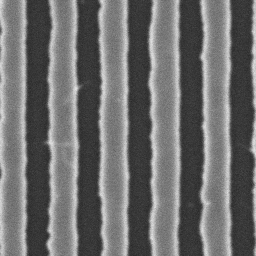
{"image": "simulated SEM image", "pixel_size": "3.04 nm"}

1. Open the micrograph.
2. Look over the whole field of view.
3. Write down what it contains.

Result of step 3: lines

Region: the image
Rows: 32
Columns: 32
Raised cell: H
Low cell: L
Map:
HHHLLLHHHHLLLHHHLLLHHHLLLHHHHLLL
HHHLLLHHHHLLHHHHLLLHHHLLLHHHHLLL
HHHLLLHHHHLLHHHHLLLHHHLLLHHHHLLL
HHHLLLLHHHLLLHHHLLLHHHLLLHHHHLLL
HHHLLLHHHHLLHHHHLLLHHHLLLLHHHLLL
HHHLLLHHHLLLLHHHLLLHHHLLLHHHHLLL
HHHLLLHHHHLLLHHHLLLHHHLLLHHHHLLL
HHHLLLHHHHLLLHHHLLLHHHLLLHHHHLLL
HHHLLLHHHLLLLHHHLLLHHHLLLHHHHLLL
HHHLLLHHHHLLLHHHLLLHHHLLLHHHHLLL
HHHLLLHHHHLLLHHHLLLHHHLLLHHHHLLL
HHHLLLHHHHLLLHHHLLLHHHLLLHHHHLLL
HHHLLLHHHHLLLHHHLLLHHHLLLHHHHLLL
HHHLLLHHHHLLLHHHLLLHHHLLLHHHHLLL
HHHLLLHHHHLLLHHHLLLHHHLLLHHHHLLL
HHHLLLHHHHLLHHHHLLLHHHLLLHHHHLLL
HHHLLLHHHHLLLHHHLLLHHHLLLLHHHLLL
HHHLLLHHHHLLLHHHLLLHHHLLLLHHHLLL
HHHLLLHHHHLLLHHHLLLHHHLLLLHHHLLL
HHHLLLHHHHLLLHHHLLLHHHLLLLHHHLLL
HHHLLLHHHHLLLHHHLLLHHHLLLLHHHLLL
HHHLLLHHHHLLLHHHLLLHHHLLLHHHHLLL
HHHLLLHHHHLLHHHHLLLHHHLLLHHHHLLL
HHHLLLHHHHLLHHHHLLLHHHLLLHHHHLLL
HHHLLLHHHHLLLHHHLLLHHHLLLHHHHLLL
HHHLLLHHHHLLLHHHLLLHHHLLLHHHHLLL
HHHLLLHHHHLLLHHHLLLHHHLLLHHHHLLL
HHHLLLHHHLLLLHHHLLLHHHLLLHHHHLLL
HHHLLLHHHHLLLHHHLLLHHHLLLHHHHLLL
HHHLLLHHHHLLLHHHLLLHHHLLLHHHHLLL
HHHLLLHHHHLLLHHHLLLHHHLLLHHHHLLL
HHHLLLHHHHLLLHHHLLLHHHLLLHHHHLLL